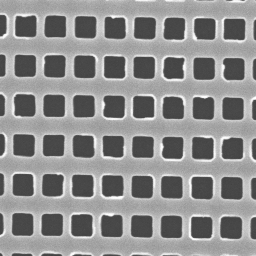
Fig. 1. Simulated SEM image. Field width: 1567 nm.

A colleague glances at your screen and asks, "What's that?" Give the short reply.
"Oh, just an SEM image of a regular array of holes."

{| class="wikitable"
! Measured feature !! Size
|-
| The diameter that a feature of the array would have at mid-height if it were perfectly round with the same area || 148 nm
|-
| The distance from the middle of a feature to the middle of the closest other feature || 181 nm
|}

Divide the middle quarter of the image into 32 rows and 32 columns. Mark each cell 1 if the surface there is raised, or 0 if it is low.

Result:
11000000110000011000000110000011
11000000110000011000000110000011
11100000110000011000000110000011
11100001111000011100001110000011
11111111111111111111111111111111
11111111111111111111111111111111
11111111111111111111111111111111
11111111111111111111111111111111
11000000110000011000001110000111
11000000110000011000000110000011
11000000110000011000000100000011
11000000110000011000000100000011
11000000110000011000000100000011
11111101111000111100001110000011
11111111111111111111111111111111
11111111111111111111111111111111
11111111111111111111111111111111
11111111111111111111111111111111
11000001110000011000001110000011
11000000110000011000000110000011
11000000110000011000000110000011
11000000110000011000000110000011
11000000110000011000000110000011
11110001111111111100001110000111
11111111111111111111111111111111
11111111111111111111111111111111
11111111111111111111111111111111
11111111111111111111111111111111
11000001100000011000001100000111
11000001100000011000001100000011
11000001100000011000001100000011
11000001100000011000001100000011